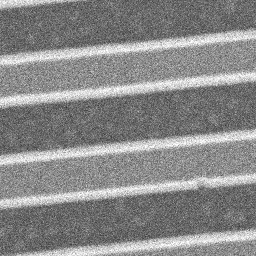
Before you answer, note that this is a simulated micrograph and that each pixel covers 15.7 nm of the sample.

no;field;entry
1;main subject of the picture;one or a few lines or trenches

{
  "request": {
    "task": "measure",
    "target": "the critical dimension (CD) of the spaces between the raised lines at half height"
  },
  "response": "873 nm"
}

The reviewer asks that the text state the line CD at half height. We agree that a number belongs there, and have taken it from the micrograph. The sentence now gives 690 nm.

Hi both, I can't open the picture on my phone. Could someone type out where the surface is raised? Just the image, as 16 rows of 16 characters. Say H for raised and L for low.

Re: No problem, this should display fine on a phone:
LLLLLLLLLLLLLLLL
LLLLLLLLLLLLLLLL
LLLLLLLLLLLLHHHH
LLHHHHHHHHHHHHHH
HHHHHHHHHHHHHHHH
HHHHHHHHHLLLLLLL
LLLLLLLLLLLLLLLL
LLLLLLLLLLLLLLLL
LLLLLLLLLLLLLLHH
LLLLLHHHHHHHHHHH
HHHHHHHHHHHHHHHH
HHHHHHHHHHHHLLLL
HHHLLLLLLLLLLLLL
LLLLLLLLLLLLLLLL
LLLLLLLLLLLLLLLL
LLLLLLLHHHHHHHHH